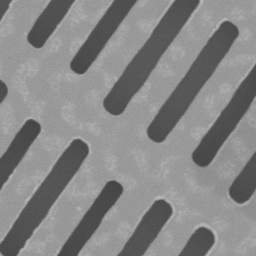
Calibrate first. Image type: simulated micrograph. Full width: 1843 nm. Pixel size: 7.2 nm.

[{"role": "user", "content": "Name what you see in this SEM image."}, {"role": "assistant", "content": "holes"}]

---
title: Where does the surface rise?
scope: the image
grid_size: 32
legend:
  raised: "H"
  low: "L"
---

LHHHHHLLLHHHHHLLLHHHHHLLLHHHHHHH
LHHHHLLLHHHHHLLLHHHHHLLLHHHHHHHH
HHHHHLLLHHHHLLLHHHHHLLLHHHHHHHHH
HHHHLLLHHHHHLLLHHHHLLLLHHHHLLLHH
HHHLLLHHHHHLLLHHHHHLLLHHHHLLLLHH
HHHHLLHHHHLLLHHHHHLLLHHHHHLLLHHH
HHHHHHHHHHLLLHHHHLLLLHHHHLLLHHHH
HHHHHHHHHLLLHHHHLLLLHHHHLLLLHHHH
HHHHHHHHHLLHHHHHLLLHHHHHLLLHHHHH
HHHHHHHHHHHHHHHLLLLHHHHLLLHHHHHL
LHHHHHHHHHHHHHLLLLHHHHLLLLHHHHLL
LHHHHHHHHHHHHHLLLHHHHHLLLHHHHLLL
HHHHHHHHHHHHHLLLHHHHHLLLHHHHHLLL
HHHHHHHHHHHHHLLLHHHHLLLLHHHHLLLH
HHHHHHHHHHHHHHHHHHHLLLLHHHHLLLHH
HHHLLHHHHHHHHHHHHHHLLLHHHHHLLLHH
HHLLLHHHHHHHHHHHHHLLLHHHHHLLLHHH
HHLLHHHHHLHHHHHHHHHLHHHHHLLLHHHH
HLLLHHHHLLLHHHHHHHHHHHHHHLLLHHHH
LLLHHHHHLLLHHHHHHHHHHHHHLLLHHHHL
LLHHHHHLLLHHHHHHHHHHHHHHHLHHHHHL
LLHHHHLLLLHHHHHHHHHHHHHHHHHHHHLL
LHHHHHLLLHHHHHHHHHHHHHHHHHHHHLLL
HHHHHLLLHHHHHLLHHHHHHHHHHHHHHLLL
HHHHLLLHHHHHLLLHHHHHHHHHHHHHHLLH
HHHLLLLHHHHHLLHHHHHLLHHHHHHHHHHH
HHHLLLHHHHHLLHHHHHLLLLHHHHHHHHHH
HHLLLHHHHHLLLHHHHHLLLHHHHHHHHHHH
HLLLLHHHHLLLHHHHHLLLHHHHHLHHHHHH
HLLLHHHHHLLHHHHHLLLLHHHHLLLHHHHH
LLLHHHHHLLLHHHHHLLLHHHHLLLLHHHHH
LLHHHHHLLLHHHHHLLLHHHHHLLLHHHHHH